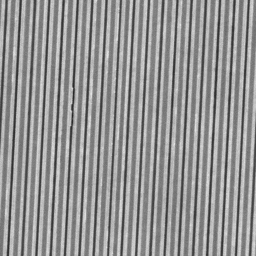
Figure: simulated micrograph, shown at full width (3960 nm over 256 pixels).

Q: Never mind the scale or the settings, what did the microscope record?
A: parallel lines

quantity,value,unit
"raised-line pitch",110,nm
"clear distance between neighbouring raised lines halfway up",73.4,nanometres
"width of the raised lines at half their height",44.4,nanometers